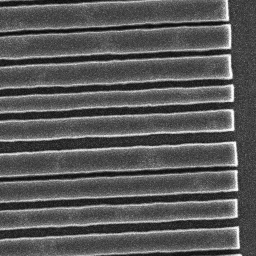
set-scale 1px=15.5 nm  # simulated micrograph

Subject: parallel lines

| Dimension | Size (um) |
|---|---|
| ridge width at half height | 0.317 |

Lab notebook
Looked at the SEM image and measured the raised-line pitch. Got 444 nanometers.